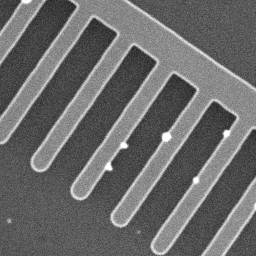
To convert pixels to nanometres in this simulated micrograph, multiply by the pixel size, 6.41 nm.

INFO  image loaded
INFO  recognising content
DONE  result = groups of lines, slits or small figures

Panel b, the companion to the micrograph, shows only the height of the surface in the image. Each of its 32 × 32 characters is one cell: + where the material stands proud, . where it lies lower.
...++....+++++++................
..+++....+++++++++..............
.+++.....++.++++++++............
+++.....+++...+++++++...........
+++....+++.....+++++++..........
++....+++.....++++++++++........
+.....+++....+++..+++++++.......
.....+++.....++....++++++++.....
....+++.....+++....+++++++++....
....+++....+++.....++.++++++++..
...+++....+++.....+++...+++++++.
..+++.....+++....+++....++++++++
..++.....+++....+++.....++++++++
.+++....+++.....+++....+++..++++
+++.....++.....+++....+++....+++
++.....+++....+++.....+++....+++
++....+++.....++.....+++....+++.
+.....++.....+++....+++.....+++.
.....+++....+++.....++.....+++..
....+++.....++.....+++....+++...
....++.....+++....+++.....+++...
..........+++.....++.....+++....
..........++.....+++....+++.....
.........+++....+++.....++.....+
.........++.....++.....+++....++
...............+++....+++.....++
..............+++.....++.....+++
..............++.....+++....+++.
....................+++.....++..
....................++.....+++..
...................+++....+++...
...................++.....++....